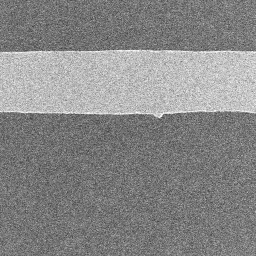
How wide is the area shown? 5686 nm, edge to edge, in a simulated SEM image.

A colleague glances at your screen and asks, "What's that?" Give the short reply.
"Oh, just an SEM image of one or a few lines or trenches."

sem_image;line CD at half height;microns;1.37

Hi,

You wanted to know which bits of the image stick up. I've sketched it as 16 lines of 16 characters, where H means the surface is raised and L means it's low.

LLLLLLLLLLLLLLLL
LLLLLLLLLLLLLLLL
LLLLLLLLLLLLLLLL
HHHHHHHHHHHHHHHH
HHHHHHHHHHHHHHHH
HHHHHHHHHHHHHHHH
HHHHHHHHHHHHHHHH
LLLLLLLLLLLLLLLL
LLLLLLLLLLLLLLLL
LLLLLLLLLLLLLLLL
LLLLLLLLLLLLLLLL
LLLLLLLLLLLLLLLL
LLLLLLLLLLLLLLLL
LLLLLLLLLLLLLLLL
LLLLLLLLLLLLLLLL
LLLLLLLLLLLLLLLL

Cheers